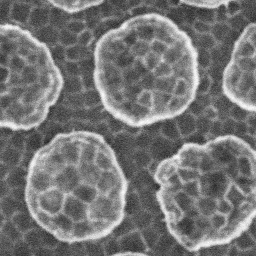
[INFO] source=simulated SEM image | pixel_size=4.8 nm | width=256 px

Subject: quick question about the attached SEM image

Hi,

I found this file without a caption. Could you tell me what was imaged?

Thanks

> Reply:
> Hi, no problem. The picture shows raised bodies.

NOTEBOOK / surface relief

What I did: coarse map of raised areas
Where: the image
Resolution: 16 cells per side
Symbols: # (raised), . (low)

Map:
....#...........
........###.....
##....######...#
###...######...#
####..######..##
####..######..##
###....#####...#
###.....#.......
....##..........
..#####....#####
..#####...######
..######..######
..######..######
..######..######
...####....####.
................